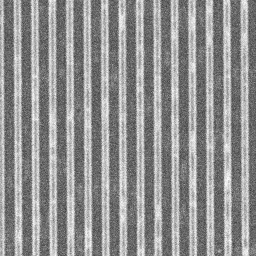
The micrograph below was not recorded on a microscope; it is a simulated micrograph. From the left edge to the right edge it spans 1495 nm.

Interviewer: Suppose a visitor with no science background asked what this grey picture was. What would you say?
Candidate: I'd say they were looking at parallel lines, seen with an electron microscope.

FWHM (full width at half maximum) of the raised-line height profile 33.6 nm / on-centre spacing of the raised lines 102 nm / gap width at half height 66.4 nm